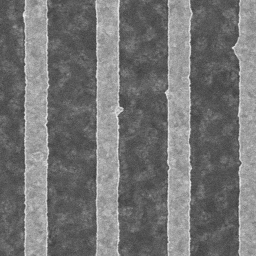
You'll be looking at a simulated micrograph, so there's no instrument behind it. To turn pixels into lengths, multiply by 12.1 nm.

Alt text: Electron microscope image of one or a few lines or trenches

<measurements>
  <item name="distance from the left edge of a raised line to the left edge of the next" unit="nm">861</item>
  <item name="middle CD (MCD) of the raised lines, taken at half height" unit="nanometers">262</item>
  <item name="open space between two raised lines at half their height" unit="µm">0.607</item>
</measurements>